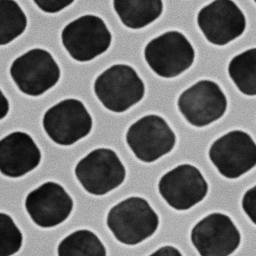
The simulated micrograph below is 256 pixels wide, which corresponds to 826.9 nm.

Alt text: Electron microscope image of a regular array of holes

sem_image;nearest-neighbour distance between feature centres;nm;191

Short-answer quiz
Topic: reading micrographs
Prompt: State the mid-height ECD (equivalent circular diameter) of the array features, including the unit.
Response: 150 nm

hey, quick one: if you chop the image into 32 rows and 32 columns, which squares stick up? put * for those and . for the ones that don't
..***....*****......******...***
...***.********.....*****.....**
...******....**....******......*
...*****.....***.********......*
..******......******...***....**
.*******......*****.....***.****
***...***....*****......******..
**.....***.*******......*****...
*......*******..***....******...
*......*****.....***..*******...
**.....*****......******...**...
***..*******......*****.....**..
.*******..**......****......****
.*****.....**...******......****
.*****.....*******..***.....****
*****......******....***..******
******.....*****......*******..*
....***...******......*****.....
.....***********......****......
.....******....**...******......
.....*****.....************.....
...******.......*****....***...*
**********.....*****......******
*****...***...******......******
***......***********......****..
***......******....**...******..
***......*****.....************.
..**....*****.......*****....**.
..************......****.....***
...******...**.....*****......**
...****......***.*******......**
..*****......******...***....***